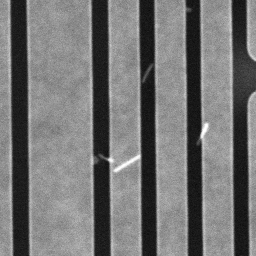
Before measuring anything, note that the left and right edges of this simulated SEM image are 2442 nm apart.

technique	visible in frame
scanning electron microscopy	groups of lines, slits or small figures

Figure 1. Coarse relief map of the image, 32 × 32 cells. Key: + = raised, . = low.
+..++++++++...+++..++++..++++..+
+..++++++++...+++..++++..++++..+
+..++++++++...+++..++++..++++..+
+..++++++++...+++..++++..++++..+
+...+++++++...+++..++++..++++..+
+...+++++++...+++..++++..++++..+
+...+++++++...+++..++++..++++..+
+...+++++++...+++..++++..++++...
+...+++++++...+++..++++..++++...
+...+++++++...+++..++++..++++...
+...+++++++...+++..++++..++++...
+...+++++++...+++...+++..++++...
+...+++++++...+++...+++..++++..+
+...+++++++...+++...+++..++++..+
+...+++++++...+++...+++..++++..+
+...+++++++...+++...+++..++++..+
+...+++++++...+++...+++..++++..+
+...+++++++...+++...+++..++++..+
+...++++++++..+++...+++..++++..+
+...++++++++..+++...+++..++++..+
+...++++++++..++++..+++..++++..+
+...++++++++..++++..+++..++++..+
+...++++++++..++++..+++..++++..+
+...++++++++..+++...+++..++++..+
+...++++++++..+++...+++..++++..+
+...++++++++..++++..+++..++++..+
+...++++++++..++++..+++..++++..+
+...++++++++..++++..+++..++++..+
+...++++++++..++++..+++..++++..+
+...++++++++..++++..+++..++++..+
+...++++++++..++++..+++..++++..+
+...++++++++..++++..+++..++++..+